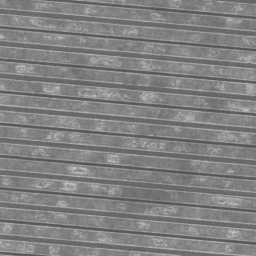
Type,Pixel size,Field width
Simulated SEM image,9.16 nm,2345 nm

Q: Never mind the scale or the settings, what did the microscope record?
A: parallel lines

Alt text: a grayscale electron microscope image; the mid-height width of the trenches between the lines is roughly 0.0353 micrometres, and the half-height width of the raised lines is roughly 106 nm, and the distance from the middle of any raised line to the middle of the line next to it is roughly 147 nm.